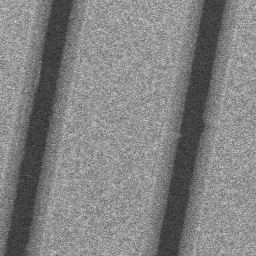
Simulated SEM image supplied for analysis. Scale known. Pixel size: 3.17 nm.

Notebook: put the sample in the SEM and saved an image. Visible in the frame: one or a few lines or trenches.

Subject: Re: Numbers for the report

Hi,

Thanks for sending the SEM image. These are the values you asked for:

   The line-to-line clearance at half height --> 141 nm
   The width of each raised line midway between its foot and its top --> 332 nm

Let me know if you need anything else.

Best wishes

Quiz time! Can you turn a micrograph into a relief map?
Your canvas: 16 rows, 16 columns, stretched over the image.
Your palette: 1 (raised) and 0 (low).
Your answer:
1100011111110001
1100011111110001
1100011111110011
1100011111100011
1100111111100011
1000111111100011
1000111111100011
1000111111100011
1000111111000111
1000111111000111
1001111111000111
0001111111000111
0001111111001111
0001111110001111
0001111110001111
0011111110001111